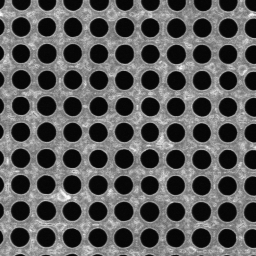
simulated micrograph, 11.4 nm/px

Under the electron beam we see a regular array of holes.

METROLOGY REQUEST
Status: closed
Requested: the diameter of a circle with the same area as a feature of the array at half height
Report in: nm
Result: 216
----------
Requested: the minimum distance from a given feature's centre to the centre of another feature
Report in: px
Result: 25.7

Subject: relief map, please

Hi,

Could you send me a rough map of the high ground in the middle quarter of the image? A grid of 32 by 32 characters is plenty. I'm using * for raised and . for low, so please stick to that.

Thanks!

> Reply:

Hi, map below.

********************************
********************************
....***....**....***....**....**
....**.....**....**.....**....**
....**.....**....**.....**.....*
....***....**....***...***....**
****************************.***
********************************
*..*****..****..*****.*****..***
....***....**....***...***....**
.....*.....**....**.....**....**
....***....**....**.....**....**
*...***...****...***...****...**
********************************
*********************.**********
....***...***....***...***...***
....**.....**....**.....**....**
.....*.....**....**.....**....**
....***...***....***...***....**
*..*****.******.*****.**********
********************************
**.*****.*****..****..*****..***
....***...***....**....***....**
.....*.....**.....*.....**....**
....**.....**....**.....**....**
*..****...****...***...***....**
********************************
********************************
....***...***....***...***...***
....**.....**....**.....**....**
....**.....**....**.....**....**
....**.....**....**....***....**